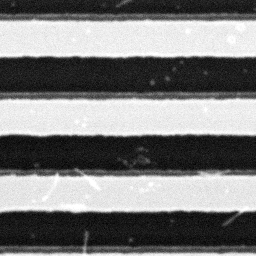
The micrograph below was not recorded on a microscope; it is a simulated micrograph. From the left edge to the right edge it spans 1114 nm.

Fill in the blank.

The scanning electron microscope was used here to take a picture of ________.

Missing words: lines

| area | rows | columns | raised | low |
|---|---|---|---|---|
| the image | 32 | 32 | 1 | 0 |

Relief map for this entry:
00000000000000000000000000000000
00000000000000000000000000000000
00000000000000000000000000000000
11111111111111111111111111111111
11111111111111111111111111111111
11111111111111111111111111111111
11111111111111111111111111111111
00000000000000000000000000000000
00000000000000000000000000000000
00000000000000000000000000000000
00000000000000000000000000000000
00000000000000000000000000000000
01111111111101111110110111001111
11111111111111111111111111111111
11111111111111111111111111111111
11111111111111111111111111111111
11111111111111111111111111111111
00000000000000000000000000000000
00000000000000000000000000000000
00000000000000000000000000000000
00000000000000000000000000000000
00000000000000000000000000000000
11111111111111111111111111111111
11111111111111111111111111111111
11111111111111111111111111111111
11111111111111111111111111111111
00000000010000000000000000000000
00000000000000000000000000000000
00000000000000000000000000000000
00000000000000000000000000000000
00000000000000000000000000000000
00000000000000000000000000000000